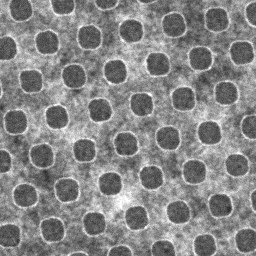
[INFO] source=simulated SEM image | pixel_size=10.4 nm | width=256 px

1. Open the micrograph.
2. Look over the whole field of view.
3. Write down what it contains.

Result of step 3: a regular array of raised bodies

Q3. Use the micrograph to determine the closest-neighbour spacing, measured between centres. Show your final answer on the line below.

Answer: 0.435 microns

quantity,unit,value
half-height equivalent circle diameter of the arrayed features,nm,265